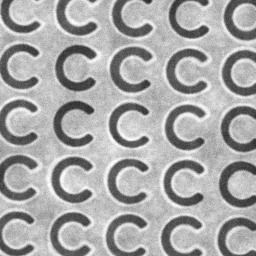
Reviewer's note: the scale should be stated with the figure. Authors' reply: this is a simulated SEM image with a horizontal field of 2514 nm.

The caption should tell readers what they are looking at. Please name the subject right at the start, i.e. an array of small figures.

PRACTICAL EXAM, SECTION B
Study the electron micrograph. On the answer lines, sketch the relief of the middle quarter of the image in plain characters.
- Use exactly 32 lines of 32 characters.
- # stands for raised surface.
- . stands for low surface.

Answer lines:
###########...###########...####
###########...###########...####
###########...###########...####
.#####.#####...##########....###
........####....###...####...###
........#####.........####......
##....########......#######.....
################..###########...
################################
#....##########...##############
.......######.......########....
..#.....####.........######.....
######.#####...####..#####......
###########...###########....###
###########...###########...####
###########...###########...####
###########...###########...####
.####..####...###########...####
........####...####..####....###
.......######........#####......
#....#########......#######.....
#############################...
################################
.....##########...##############
.......######.......#######.....
........####.........#####......
.####..####....####..####.......
###########...###########...####
##########....###########..#####
##########...###########...#####
###########..############..#####
#####.#####...###########...####